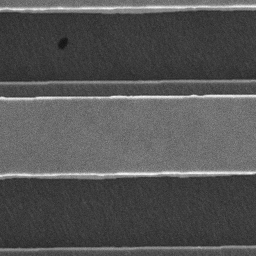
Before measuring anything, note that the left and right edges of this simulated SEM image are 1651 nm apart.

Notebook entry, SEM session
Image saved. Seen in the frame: lines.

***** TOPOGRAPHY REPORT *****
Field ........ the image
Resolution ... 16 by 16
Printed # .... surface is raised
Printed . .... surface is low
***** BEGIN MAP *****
########........
................
................
................
................
................
################
################
################
################
################
................
................
................
................
................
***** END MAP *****